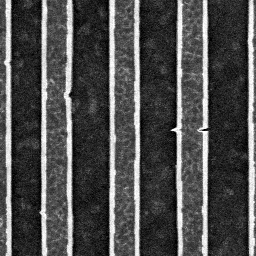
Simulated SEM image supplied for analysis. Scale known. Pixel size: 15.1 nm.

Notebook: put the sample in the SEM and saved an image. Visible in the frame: one or a few lines or trenches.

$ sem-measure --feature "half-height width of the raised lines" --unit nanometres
388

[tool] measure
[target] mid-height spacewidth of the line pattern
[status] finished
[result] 631 nm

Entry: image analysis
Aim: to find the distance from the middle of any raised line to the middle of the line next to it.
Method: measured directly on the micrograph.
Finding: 1020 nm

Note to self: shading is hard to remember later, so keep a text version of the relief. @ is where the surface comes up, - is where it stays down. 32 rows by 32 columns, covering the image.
@-----@@@-----@@@------@@@-----@
@-----@@@-----@@@------@@@-----@
@-----@@@-----@@@-----@@@@-----@
@-----@@@-----@@@-----@@@@-----@
@-----@@@-----@@@-----@@@@-----@
@-----@@@-----@@@-----@@@@-----@
@-----@@@-----@@@-----@@@@-----@
@-----@@@-----@@@-----@@@@-----@
@-----@@@-----@@@-----@@@@-----@
@-----@@@-----@@@-----@@@@-----@
@-----@@@-----@@@-----@@@@-----@
@-----@@------@@@-----@@@@-----@
@-----@@@-----@@@-----@@@@-----@
@-----@@@-----@@@-----@@@@-----@
@----@@@@-----@@@-----@@@@-----@
@----@@@@-----@@@-----@@@@-----@
@----@@@@-----@@@-----@@@@-----@
@----@@@@-----@@@-----@@@@-----@
@----@@@@-----@@@-----@@@@-----@
@----@@@@-----@@@-----@@@@-----@
@----@@@@-----@@@-----@@@@------
@----@@@@-----@@@-----@@@@------
@----@@@@-----@@@-----@@@@------
@----@@@@-----@@@-----@@@@------
@----@@@@-----@@@-----@@@@-----@
@----@@@@-----@@@-----@@@@-----@
@----@@@@-----@@@-----@@@@-----@
@----@@@@-----@@@-----@@@@------
@----@@@@-----@@@-----@@@@------
@-----@@@-----@@@------@@@------
@-----@@@-----@@@------@@@------
@-----@@@-----@@@------@@@------